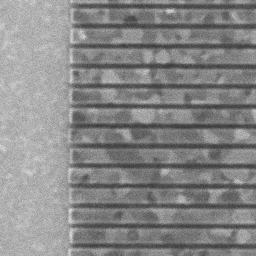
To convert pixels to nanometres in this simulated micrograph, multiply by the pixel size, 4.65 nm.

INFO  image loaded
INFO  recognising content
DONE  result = parallel lines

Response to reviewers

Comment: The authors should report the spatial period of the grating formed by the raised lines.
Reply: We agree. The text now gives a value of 92.9 nm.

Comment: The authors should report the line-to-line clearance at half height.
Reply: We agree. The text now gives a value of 32 nanometers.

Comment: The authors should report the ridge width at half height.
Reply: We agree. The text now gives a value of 63.3 nanometres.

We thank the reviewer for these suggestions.